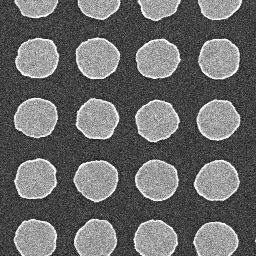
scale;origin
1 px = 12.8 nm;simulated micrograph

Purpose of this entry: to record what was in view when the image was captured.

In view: a regular array of raised bodies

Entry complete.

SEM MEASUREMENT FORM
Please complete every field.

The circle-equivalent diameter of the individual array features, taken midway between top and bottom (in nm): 527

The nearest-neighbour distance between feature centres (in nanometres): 768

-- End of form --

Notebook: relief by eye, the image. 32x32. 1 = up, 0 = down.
00111110001111100111110001111100
00011100001111000011110001111000
00000000000000000001000000000000
00000000000000000000000000000000
00000000000000000000000000000000
00011110001111000011100000111000
00111110001111100111110001111100
00111110001111100111110001111100
00111110001111000111110001111100
00001100000110000011100000111000
00000000000000000000000000000000
00000000000000000000000000000000
00001000000110000000000000000000
00111110001111000011110001111000
00111110001111100111110001111100
00111110001111100111110001111100
00011100001111000111110001111000
00000000000000000001000000000000
00000000000000000000000000000000
00000000000000000000000000000000
00011100000111000011100000111000
00111110001111100111110001111000
00111110011111100111110011111100
00111110001111000111110011111100
00011100000111000011100001111000
00000000000000000000000000000000
00000000000000000000000000000000
00001000000010000000000000000000
00111110001111000111100001111000
00111110001111100111110011111100
00111110011111100111110011111100
00011110001111000111110001111000